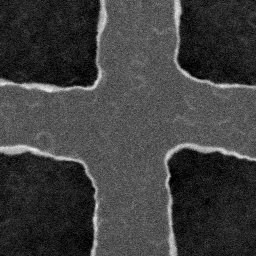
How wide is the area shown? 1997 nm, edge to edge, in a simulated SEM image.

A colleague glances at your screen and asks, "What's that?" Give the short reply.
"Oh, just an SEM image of holes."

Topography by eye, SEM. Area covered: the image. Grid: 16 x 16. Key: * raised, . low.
......*****.....
......*****.....
......*****.....
......*****.....
......******....
***.************
****************
****************
****************
..*********...**
.....*****......
......*****.....
......*****.....
......*****.....
......*****.....
......*****.....